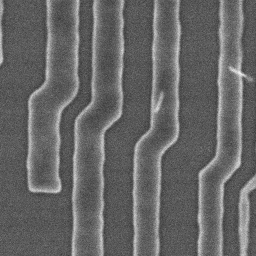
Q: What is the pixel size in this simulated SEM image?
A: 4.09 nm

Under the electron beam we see groups of lines, slits or small figures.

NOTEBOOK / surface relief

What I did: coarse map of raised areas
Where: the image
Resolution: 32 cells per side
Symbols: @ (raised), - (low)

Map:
------@@@@--@@@----@@@------@@--
------@@@@--@@@----@@@------@@--
------@@@@--@@@----@@@------@@--
------@@@@--@@@----@@@------@@--
------@@@@--@@@----@@@------@@--
------@@@@--@@@----@@@------@@--
------@@@@--@@@----@@@------@@--
------@@@@--@@@----@@@-----@@@--
------@@@@--@@@----@@@-----@@@--
------@@@@--@@@----@@@-----@@@--
-----@@@@@--@@@----@@@-----@@@--
----@@@@@@--@@@----@@@-----@@@--
----@@@@@---@@@----@@@-----@@@--
----@@@@---@@@@----@@@-----@@@--
----@@@@--@@@@@----@@@-----@@@--
----@@@--@@@@@-----@@@-----@@@--
----@@@--@@@@-----@@@@-----@@@--
----@@@--@@@@-----@@@@-----@@@--
----@@@--@@@@----@@@@------@@@--
---@@@@--@@@@----@@@-------@@@--
---@@@@--@@@@----@@@------@@@@--
---@@@@--@@@@----@@@-----@@@@---
----@@@--@@@@----@@@-----@@@---@
----@@@@-@@@@----@@@-----@@@---@
---------@@@@----@@@-----@@@--@-
---------@@@@----@@@-----@@@--@-
---------@@@@----@@@-----@@@--@-
---------@@@@----@@@-----@@@--@-
---------@@@@----@@@-----@@@--@-
---------@@@@----@@@-----@@@--@-
---------@@@@----@@@-----@@@--@-
---------@@@@----@@@-----@@@--@-